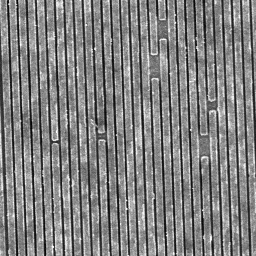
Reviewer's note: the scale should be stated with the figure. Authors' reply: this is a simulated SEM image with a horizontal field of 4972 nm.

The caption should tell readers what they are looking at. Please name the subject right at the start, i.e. parallel lines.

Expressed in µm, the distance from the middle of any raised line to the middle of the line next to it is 0.181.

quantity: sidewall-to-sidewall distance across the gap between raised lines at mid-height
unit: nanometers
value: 48.5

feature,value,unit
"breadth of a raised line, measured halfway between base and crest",131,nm